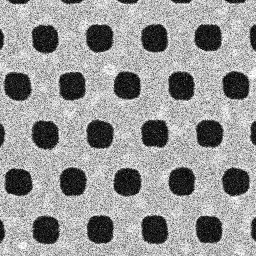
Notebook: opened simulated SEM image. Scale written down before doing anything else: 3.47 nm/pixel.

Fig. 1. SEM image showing a regular array of holes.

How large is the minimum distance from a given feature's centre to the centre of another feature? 0.188 microns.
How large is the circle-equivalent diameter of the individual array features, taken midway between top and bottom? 99.5 nanometers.